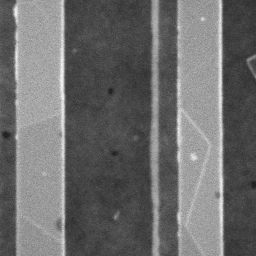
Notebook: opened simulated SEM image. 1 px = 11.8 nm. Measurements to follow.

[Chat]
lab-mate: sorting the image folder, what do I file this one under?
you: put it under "lines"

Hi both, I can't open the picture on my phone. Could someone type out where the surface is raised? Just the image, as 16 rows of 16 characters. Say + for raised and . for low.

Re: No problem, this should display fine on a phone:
++++......++++..
++++......++++..
++++......++++..
++++......++++..
++++......++++..
++++......++++..
++++......++++..
++++......++++..
++++......++++..
++++......++++..
++++......++++..
++++......++++..
++++......++++..
++++......++++..
++++......++++..
++++......++++..